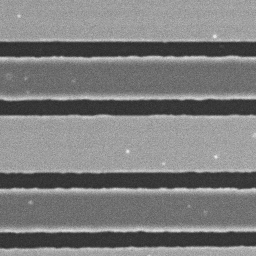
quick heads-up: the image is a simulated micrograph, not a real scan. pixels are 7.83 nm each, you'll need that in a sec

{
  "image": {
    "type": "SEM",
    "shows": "lines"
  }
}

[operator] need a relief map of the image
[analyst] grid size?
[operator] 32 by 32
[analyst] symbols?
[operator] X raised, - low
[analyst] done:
XXXXXXXXXXXXXXXXXXXXXXXXXXXXXXXX
XXXXXXXXXXXXXXXXXXXXXXXXXXXXXXXX
XXXXXXXXXXXXXXXXXXXXXXXXXXXXXXXX
XXXXXXXXXXXXXXXXXXXXXXXXXXXXXXXX
XXXXXXXXXXXXXXXXXXXXXXXXXXXXXXXX
--------------------------------
--------------------------------
XXXXXXXXXXXXXXXXXXXXXXXXXXXXXXXX
XXXXXXXXXXXXXXXXXXXXXXXXXXXXXXXX
XXXXXXXXXXXXXXXXXXXXXXXXXXXXXXXX
XXXXXXXXXXXXXXXXXXXXXXXXXXXXXXXX
XXXXXXXXXXXXXXXXXXXXXXXXXXXXXXXX
-X------------------------------
--------------------------------
--------XX--XX-----XXXXX-----X-X
XXXXXXXXXXXXXXXXXXXXXXXXXXXXXXXX
XXXXXXXXXXXXXXXXXXXXXXXXXXXXXXXX
XXXXXXXXXXXXXXXXXXXXXXXXXXXXXXXX
XXXXXXXXXXXXXXXXXXXXXXXXXXXXXXXX
XXXXXXXXXXXXXXXXXXXXXXXXXXXXXXXX
XXXXXXXXXXXXXXXXXXXXXXXXXXXXXXXX
XXXXX--XXXXXXX------------------
--------------------------------
--------------------------------
XXXXXXXXXXXXXXXXXXXXXXXXXXXXXXXX
XXXXXXXXXXXXXXXXXXXXXXXXXXXXXXXX
XXXXXXXXXXXXXXXXXXXXXXXXXXXXXXXX
XXXXXXXXXXXXXXXXXXXXXXXXXXXXXXXX
XXXXXXXXXXXXXXXXXXXXXXXXXXXXXXXX
--------------------------------
--------------------------------
XXXXXXXXXXXXXXXXXXXXXXXXXXXXXXXX